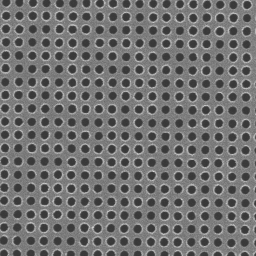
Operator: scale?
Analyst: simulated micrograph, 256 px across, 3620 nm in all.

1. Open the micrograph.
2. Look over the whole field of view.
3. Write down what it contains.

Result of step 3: a regular array of holes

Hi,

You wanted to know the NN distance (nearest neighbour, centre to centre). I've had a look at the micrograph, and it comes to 184 nanometres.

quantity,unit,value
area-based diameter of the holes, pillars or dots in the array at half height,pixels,8.44